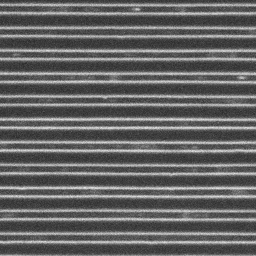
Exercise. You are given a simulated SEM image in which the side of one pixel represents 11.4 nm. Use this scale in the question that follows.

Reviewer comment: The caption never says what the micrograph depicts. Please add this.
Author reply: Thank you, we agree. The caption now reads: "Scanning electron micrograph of parallel lines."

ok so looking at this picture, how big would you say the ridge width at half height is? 180 nm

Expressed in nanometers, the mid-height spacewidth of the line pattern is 80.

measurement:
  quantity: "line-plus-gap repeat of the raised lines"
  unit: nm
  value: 261